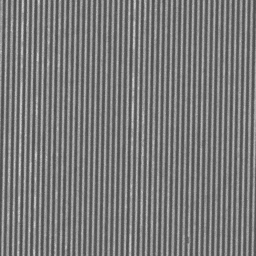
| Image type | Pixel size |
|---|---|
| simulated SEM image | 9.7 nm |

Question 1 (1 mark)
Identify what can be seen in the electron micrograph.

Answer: parallel lines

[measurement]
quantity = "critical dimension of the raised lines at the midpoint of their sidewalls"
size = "19.4 nm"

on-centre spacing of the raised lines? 51.6 nanometres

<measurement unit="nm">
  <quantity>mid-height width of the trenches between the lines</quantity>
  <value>27.9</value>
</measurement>